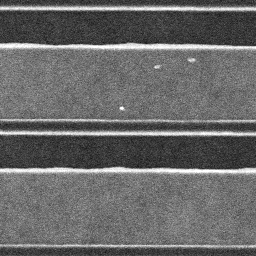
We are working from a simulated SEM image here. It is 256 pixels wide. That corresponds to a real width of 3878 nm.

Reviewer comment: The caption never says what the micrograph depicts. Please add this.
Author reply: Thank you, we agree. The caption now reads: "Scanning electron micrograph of lines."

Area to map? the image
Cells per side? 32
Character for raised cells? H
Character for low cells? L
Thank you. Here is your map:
HHHHHHHHHHHHHHHHHHHHHHHHHHHHHHHH
LLLLLLLLLLLLLLLLLLLLLLLLLLLLLLLL
LLLLLLLLLLLLLLLLLLLLLLLLLLLLLLLL
LLLLLLLLLLLLLLLLLLLLLLLLLLLLLLLL
LLLLLLLLLLLLLLLLLLLLLLLLLLLLLLLL
LLLLLLLLLLLLLLLLLLLLLLLLLLLLLLLL
HHHHHHHHHHHHHHHHHHHHHHHHHHHHHHHH
HHHHHHHHHHHHHHHHHHHHHHHHHHHHHHHH
HHHHHHHHHHHHHHHHHHHHHHHHHHHHHHHH
HHHHHHHHHHHHHHHHHHHHHHHHHHHHHHHH
HHHHHHHHHHHHHHHHHHHHHHHHHHHHHHHH
HHHHHHHHHHHHHHHHHHHHHHHHHHHHHHHH
HHHHHHHHHHHHHHHHHHHHHHHHHHHHHHHH
HHHHHHHHHHHHHHHHHHHHHHHHHHHHHHHH
HHHHHHHHHHHHHHHHHHHHHHHHHHHHHHHH
HHHHHHHHHHHHHHHHHHHHHHHHHHHHHHHH
HHHHHHHHHHHHHHHHHHHHHHHHHHHHHHHH
LLLLLLLLLLLLLLLLLLLLLLLLLLLLLLLL
LLLLLLLLLLLLLLLLLLLLLLLLLLLLLLLL
LLLLLLLLLLLLLLLLLLLLLLLLLLLLLLLL
LLLLLLLLLLLLLLLLLLLLLLLLLLLLLLLL
HHHHHHHHHHHHHHHHHHHHHHHHHHHHHHHH
HHHHHHHHHHHHHHHHHHHHHHHHHHHHHHHH
HHHHHHHHHHHHHHHHHHHHHHHHHHHHHHHH
HHHHHHHHHHHHHHHHHHHHHHHHHHHHHHHH
HHHHHHHHHHHHHHHHHHHHHHHHHHHHHHHH
HHHHHHHHHHHHHHHHHHHHHHHHHHHHHHHH
HHHHHHHHHHHHHHHHHHHHHHHHHHHHHHHH
HHHHHHHHHHHHHHHHHHHHHHHHHHHHHHHH
HHHHHHHHHHHHHHHHHHHHHHHHHHHHHHHH
HHHHHHHHHHHHHHHHHHHHHHHHHHHHHHHH
HHHHHHHHHHHHHHHHHHHHHHHHHHHHHHHH